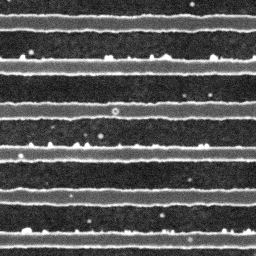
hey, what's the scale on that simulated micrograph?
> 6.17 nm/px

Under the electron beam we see lines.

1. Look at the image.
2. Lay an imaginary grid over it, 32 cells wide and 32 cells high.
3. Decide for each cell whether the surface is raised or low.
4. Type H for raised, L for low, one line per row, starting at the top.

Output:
LLLLLLLLLLLLLLLLLLLLLLLLLLLLLLLL
LLLLLLLLLLLLLLLLLLLLLLLLLLLLLLLL
HHHHHHHHHHHHHHHHHHHHHHHHHHHHHHHH
HHHHHHHHHHHHHHHHHHHHHHHHHHHHHHHH
LLLLLLLLLLLLLLLLLLLLLLLLLLLLLLLL
LLLLLLLLLLLLLLLLLLLLLLLLLLLLLLLL
LLLLLLLLLLLLLLLLLLLLLLLLLLLLLLLL
HHHHHHHHHHHHHHHHHHHHHHHLLLHHHHLH
HHHHHHHHHHHHHHHHHHHHHHHHHHHHHHHH
LLLLLLLLLLLLLLLLLLLLLLLLLLLLLLLL
LLLLLLLLLLLLLLLLLLLLLLLLLLLLLLLL
LLLLLLLLLLLLLLLLLLLLLLLLLLLLLLLL
LLLLLLLLLLLLLLLLLLLLLLLLLLLLLLLL
HHHHHHHHHHHHHHHHHHHHHHHHHHHHHHHH
HHHHHHHHHHHHHHHHHHHHHHHHHHHHHHHH
LLLLLLLLLLLLLLLLLLLLLLLLLLLLLLLL
LLLLLLLLLLLLLLLLLLLLLLLLLLLLLLLL
LLLLLLLLLLLLLLLLLLLLLLLLLLLLLLLL
HHHHHHHHHHHHHHHHHHHHHHHHHHHHHHHH
HHHHHHHHHHHHHHHHHHHHHHHHHHHHHHHH
LLLLLLLLLLLLLLLLLLLLLLLLLLLLLLLL
LLLLLLLLLLLLLLLLLLLLLLLLLLLLLLLL
LLLLLLLLLLLLLLLLLLLLLLLLLLLLLLLL
LLLLLLLLLLLLLLLLLLLLLLLLLLLLLLLL
HHHHHHHHHHHHHHHHHHHHHHHHHHHHHHHH
LLHHHHHHHHHHHHHHHHHHHHHHHHHHHHHH
LLLLLLLLLLLLLLLLLLLLLLLLLLLLLLLL
LLLLLLLLLLLLLLLLLLLLLLLLLLLLLLLL
LLLLLLLLLLLLLLLLLLLLLLLLLLLLLLLL
HHHHHHHHHHHHHHHHHHHHHHHHHHHHHHHH
HHHHHHHHHHHHHHHHHHHHHHHHHHHHHHHH
LLLLLLLLLLLLLLLLLLLLLLLLLLLLLLLL